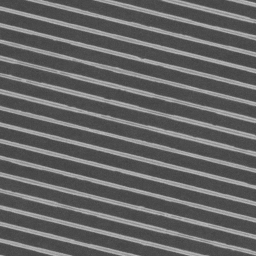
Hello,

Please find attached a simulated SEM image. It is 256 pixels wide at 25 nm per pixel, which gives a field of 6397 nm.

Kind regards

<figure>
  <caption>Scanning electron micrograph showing parallel lines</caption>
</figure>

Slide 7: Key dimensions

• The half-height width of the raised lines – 69.8 nm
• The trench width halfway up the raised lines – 12.6 px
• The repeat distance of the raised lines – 0.402 µm